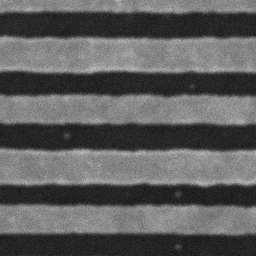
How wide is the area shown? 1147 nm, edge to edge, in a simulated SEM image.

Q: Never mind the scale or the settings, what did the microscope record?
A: lines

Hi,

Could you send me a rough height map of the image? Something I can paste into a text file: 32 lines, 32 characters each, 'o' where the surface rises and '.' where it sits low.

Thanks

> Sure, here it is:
oooooooooooooooooooooooooooooooo
......................o.........
................................
................................
................................
oooooooooooooooooooooooooooooooo
oooooooooooooooooooooooooooooooo
oooooooooooooooooooooooooooooooo
oooooooooooooooooooooooooooooooo
................................
................................
................................
oooooooooooooooooooooooooooooooo
oooooooooooooooooooooooooooooooo
oooooooooooooooooooooooooooooooo
................................
................................
................................
................................
oooooooooooooooooooooooooooooooo
oooooooooooooooooooooooooooooooo
oooooooooooooooooooooooooooooooo
oooooooooooooooooooooooooooooooo
................................
................................
................................
oooooooooooooooooooooooooooooooo
oooooooooooooooooooooooooooooooo
oooooooooooooooooooooooooooooooo
................................
................................
................................